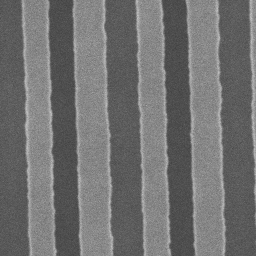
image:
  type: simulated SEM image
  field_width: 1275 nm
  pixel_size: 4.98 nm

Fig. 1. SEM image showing lines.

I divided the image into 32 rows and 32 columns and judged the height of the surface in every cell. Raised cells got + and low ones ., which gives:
...+++...++++....+++...++++....+
...+++...++++....+++...++++....+
...+++...++++....+++...++++....+
...+++...++++....+++....+++....+
...+++...++++....+++....+++....+
...+++...++++....++++...+++....+
...+++...++++....++++...+++....+
...+++...++++....+++....+++....+
...+++...++++....++++...+++....+
...+++...++++....++++...+++.....
...+++...++++....++++...++++....
...+++...++++....++++...++++....
...+++...++++....++++...++++....
...+++...++++....++++...++++...+
...+++....+++.....+++...++++...+
...+++....++++....+++...++++....
...+++....++++....+++...++++....
...++++...++++....+++...++++....
...+++....++++....+++...++++....
...++++...++++....+++...++++....
....+++...++++....+++...++++....
...++++...++++....+++...++++....
....+++...++++....+++...++++....
....+++...++++....+++...++++....
....+++...++++....+++...++++....
....+++...++++....+++...++++....
....+++...++++....+++...++++....
....+++...++++....+++...++++....
....+++...++++....+++...++++....
....+++...++++....+++...++++....
....+++...++++....+++...++++....
....+++...++++....+++...++++....